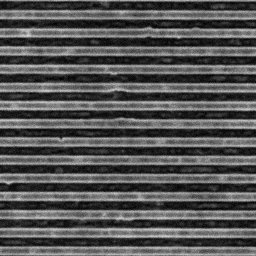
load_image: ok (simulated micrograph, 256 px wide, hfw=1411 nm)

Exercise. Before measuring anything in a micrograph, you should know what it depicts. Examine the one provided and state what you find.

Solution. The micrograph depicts parallel lines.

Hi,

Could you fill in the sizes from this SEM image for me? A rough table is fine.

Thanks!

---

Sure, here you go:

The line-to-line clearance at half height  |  53.1 nanometers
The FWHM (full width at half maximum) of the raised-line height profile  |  47.5 nanometres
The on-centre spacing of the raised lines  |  100 nm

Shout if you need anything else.